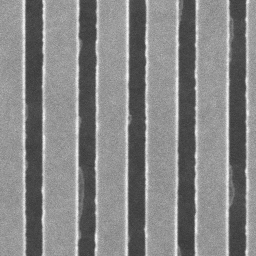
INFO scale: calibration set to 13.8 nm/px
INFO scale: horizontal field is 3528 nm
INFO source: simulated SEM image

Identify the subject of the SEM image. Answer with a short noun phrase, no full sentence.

lines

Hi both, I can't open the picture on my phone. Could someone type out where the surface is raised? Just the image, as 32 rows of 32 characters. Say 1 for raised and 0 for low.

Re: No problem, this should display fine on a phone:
11100111110011110011110001111001
11100111110011110011110001111001
11100111110011110011110001111001
11100111110011110011110001111001
11100111110011110011110001111001
11100111110011110011110011111001
11100111110011110011110001111001
11100111110011110011110011111001
11100111110011110011110011111001
11100111110011110011110011111001
11100111110011110011110011111001
11100111110011110011110011111001
11100111110011110011110001111001
11100111110011110011110011111001
11100111110011110011110011111001
11100111110011110011110011111001
11100111110011110011110011111001
11100111110011110011110011111001
11100111110011110011110001111001
11100111110011110011110011111001
11100111110011110011110011111001
11100111110011110011110011111001
11100111110011110011110011111001
11100111110011110011110011111001
11100111110011110011110011111001
11100111110011110011110011111001
11100111110011110011110011111001
11100111110011110011110011111001
11100111110011110011110011111001
11100111110011110011110011111001
11100111110011110011110011111001
11100111110011110011110011111001